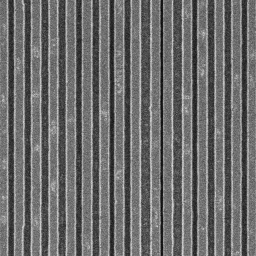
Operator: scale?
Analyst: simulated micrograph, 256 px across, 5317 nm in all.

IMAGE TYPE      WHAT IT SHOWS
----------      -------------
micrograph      parallel lines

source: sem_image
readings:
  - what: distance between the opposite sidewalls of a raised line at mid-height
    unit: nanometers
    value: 200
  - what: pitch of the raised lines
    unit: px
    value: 16.7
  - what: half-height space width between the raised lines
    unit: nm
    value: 148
